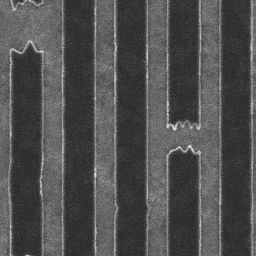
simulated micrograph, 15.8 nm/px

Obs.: parallel lines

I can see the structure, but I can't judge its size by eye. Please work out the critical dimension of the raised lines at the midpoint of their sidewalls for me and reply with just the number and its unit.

0.524 um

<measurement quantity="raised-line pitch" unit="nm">827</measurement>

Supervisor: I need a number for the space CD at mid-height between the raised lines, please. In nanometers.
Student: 305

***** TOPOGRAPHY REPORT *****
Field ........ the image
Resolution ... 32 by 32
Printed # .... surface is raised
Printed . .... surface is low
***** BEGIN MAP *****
.##.#...####..####...####...###.
........####..####...####...###.
........####..####...####...###.
........####..####...####...###.
........####..####...####...####
...#....####..####...####...###.
.####...####..####...####...###.
.####...####..####...####...###.
.####...####..####...####...###.
.####...####..####...####...###.
.####...####..####...####...###.
.####...####..####...####...####
.####...####..####...####...###.
.####...####..####...####...###.
.####...####..####...####...###.
.####...####..####...####...###.
.####...####..####..........###.
.####...####..####..........####
.####...####..####.....#....####
.####...####..####...####...####
.####...####..####...####...####
.####...####..####...####...####
.####...####..####...####...####
.####...####..####...####...####
.####...####..####...####...####
.####...####..#####..####...####
.####...####..#####..####...####
.####...####..####...####...####
.####...####..####...####...####
.####...####..####...####...####
.####...####..####...####...####
.####...####..####...####...####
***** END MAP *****